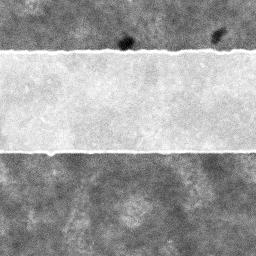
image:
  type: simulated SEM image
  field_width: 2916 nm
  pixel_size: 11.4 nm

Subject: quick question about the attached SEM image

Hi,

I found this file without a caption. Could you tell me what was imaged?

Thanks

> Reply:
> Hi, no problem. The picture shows one or a few lines or trenches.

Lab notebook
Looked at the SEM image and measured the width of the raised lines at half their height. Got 1.15 um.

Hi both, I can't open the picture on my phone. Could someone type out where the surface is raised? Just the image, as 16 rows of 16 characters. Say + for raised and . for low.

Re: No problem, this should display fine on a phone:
................
................
................
++++++++++++++++
++++++++++++++++
++++++++++++++++
++++++++++++++++
++++++++++++++++
++++++++++++++++
.++++++++++.....
................
................
................
................
................
................